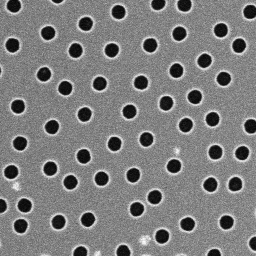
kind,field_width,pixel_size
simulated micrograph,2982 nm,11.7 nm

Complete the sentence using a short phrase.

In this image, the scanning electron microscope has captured a regular array of holes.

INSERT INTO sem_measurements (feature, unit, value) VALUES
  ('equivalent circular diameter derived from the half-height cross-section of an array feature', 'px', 14.5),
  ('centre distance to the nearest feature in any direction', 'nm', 333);